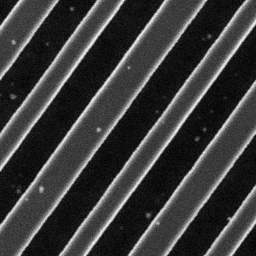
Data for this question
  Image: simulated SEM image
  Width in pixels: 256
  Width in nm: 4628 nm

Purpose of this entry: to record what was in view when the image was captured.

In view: lines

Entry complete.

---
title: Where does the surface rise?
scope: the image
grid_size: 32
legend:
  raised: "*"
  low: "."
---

..*****.....***.....*****.....**
.*****.....***......*****.....**
.****.....****.....*****.....***
*****.....***.....*****.....****
****.....***.....******....****.
***.....****.....*****.....***..
***....****.....*****.....***...
**.....***.....*****.....****...
*.....***......*****.....***....
.....****.....*****.....***.....
.....***.....*****.....***......
....***.....*****.....****.....*
...****....******.....***.....**
..****.....*****.....***.....***
..***.....*****.....***......***
.***.....******....****.....****
****.....*****.....***.....*****
***.....*****.....***......****.
**.....*****.....****.....*****.
*.....******....****.....*****..
*.....*****.....***.....*****...
.....*****.....***......****....
....*****.....****.....*****....
....*****.....***.....*****.....
...*****.....***.....*****.....*
..*****.....***......****.....**
.******....****.....*****.....**
.*****.....***.....*****.....***
*****.....***......****.....***.
****.....****.....*****....****.
****....****.....*****.....***..
***.....***.....*****.....***...